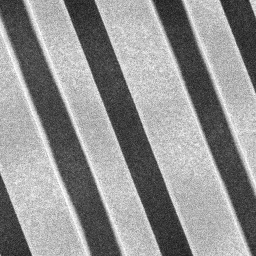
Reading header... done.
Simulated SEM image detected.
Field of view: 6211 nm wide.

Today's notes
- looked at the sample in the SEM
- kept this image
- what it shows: lines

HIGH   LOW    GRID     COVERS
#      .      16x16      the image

..##..####..##..
..##...###..##..
...##..###..###.
#..##..####..##.
#..###..###..##.
#...##..###...##
##..##..####..##
##...##..###..##
###..##..####..#
###..###..###..#
###...##..###...
####..##..####..
.###...##..###..
.####..##..####.
.####..###..###.
..###...##..###.